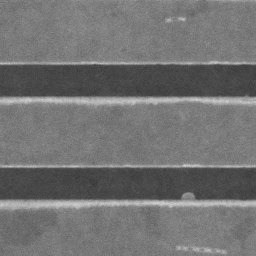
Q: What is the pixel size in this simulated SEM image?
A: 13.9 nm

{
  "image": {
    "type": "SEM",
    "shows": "lines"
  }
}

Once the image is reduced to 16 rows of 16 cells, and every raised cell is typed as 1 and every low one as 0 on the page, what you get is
1111111111111111
1111111111111111
1111111111111111
1111111111111111
0000000000000000
0000000000000000
1111111111111111
1111111111111111
1111111111111111
1111111111111111
0000000000000000
0000000000000000
0000000000000000
1111111111111111
1111111111111111
1111111111111111